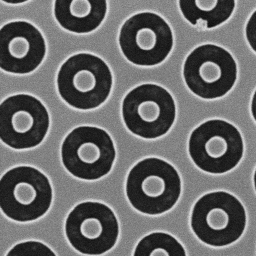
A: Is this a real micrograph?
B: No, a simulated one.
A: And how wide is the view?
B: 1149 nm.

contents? a regular array of ring-shaped grooves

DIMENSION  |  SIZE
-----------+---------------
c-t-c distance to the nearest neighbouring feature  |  0.323 µm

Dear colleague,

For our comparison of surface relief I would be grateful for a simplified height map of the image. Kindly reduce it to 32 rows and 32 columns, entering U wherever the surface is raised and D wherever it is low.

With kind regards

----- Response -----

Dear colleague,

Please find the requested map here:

UUUUUUUDDUUDDUUUUUUUUUDDDUUDDUUU
UUUUUUUDDUUDDUUUUUUUUUUDDDDDDUUU
UUUUUUUDDDDDDUUUDDDDUUUDDDDDUUUD
DDDDUUUUDDDDUUUDDDDDDUUUUUUUUUUD
DDDDDUUUUUUUUUUDDUUDDDUUUUUUUUUD
DUUUDDUUUUUUUUUDDUUDDDUUUUUUUUUD
DUUDDDUUUUUUUUUDDDDDDUUUDDDDUUUU
DDDDDUUUDDDDDUUUDDDDUUUDDDDDDUUU
DDDDUUUUDDDDDDUUUUUUUUUDDUUDDDUU
UUUUUUUDDUUUDDUUUUUUUUUDDUUDDDUU
UUUUUUUDDUUUDDUUUUDUUUUDDDDDDUUU
UUUUUUUDDDDDDDUUDDDDDUUUDDDDUUUU
UDDDDUUUDDDDDUUDDDDDDDUUUUUUUUUU
DDDDDDUUUDDDUUUDDUUUDDUUUUUUUUUD
DDUUDDUUUUUUUUUDDDUUDDUUUUUUUUUU
DDUUDDUUUUUUUUUUDDDDDDUUUDDDDUUU
DDUDDDUUUDDDDUUUDDDDDUUUDDDDDDUU
DDDDDUUUDDDDDDUUUUUUUUUUDDUUDDUU
UUDUUUUUDDUUDDUUUUUUUUUUDDUUDDUU
UUUUUUUUDDUUDDUUUUUUUUUUDDUDDDUU
UUUUUUUUDDDDDDUUUDDDDUUUDDDDDDUU
UDDDDUUUUDDDDDUUDDDDDDUUUUDDUUUU
DDDDDDUUUUUUUUUUDDUUDDDUUUUUUUUU
DDUUDDUUUUUUUUUUDDUUDDDUUUUUUUUU
DDUUDDDUUUUUUUUUDDDDDDUUUDDDDUUU
DDDDDDUUUUDDDUUUDDDDDDUUDDDDDDUU
DDDDDDUUUDDDDDUUUUDDUUUUDDUUDDDU
UUDDUUUUDDDUDDDUUUUUUUUUDDUUDDDU
UUUUUUUUDDUUUDDUUUUUUUUUDDDUDDDU
UUUUUUUUDDDUDDDUUUDDDUUUUDDDDDUU
UUDDDUUUUDDDDDUUUDDDDDDUUUDDDUUU
UDDDDDDUUUDDDUUUUDDUUDDUUUUUUUUU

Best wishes